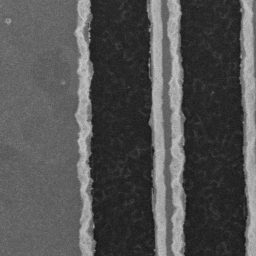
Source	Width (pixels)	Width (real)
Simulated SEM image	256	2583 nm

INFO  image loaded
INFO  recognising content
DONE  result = one or a few lines or trenches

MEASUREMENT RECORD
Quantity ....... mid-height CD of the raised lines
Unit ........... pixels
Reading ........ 19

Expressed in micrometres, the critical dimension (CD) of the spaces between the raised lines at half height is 0.741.